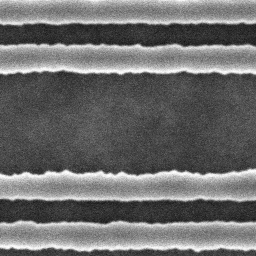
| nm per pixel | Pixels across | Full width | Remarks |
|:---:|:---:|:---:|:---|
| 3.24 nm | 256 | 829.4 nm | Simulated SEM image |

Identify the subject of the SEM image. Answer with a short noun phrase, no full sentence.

lines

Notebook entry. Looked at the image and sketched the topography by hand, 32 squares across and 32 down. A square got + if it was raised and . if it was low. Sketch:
++++++++++++++++++++++++++++++++
++++++++++++++++++++++++++++++++
++++++++++++++++++++++++++++++++
................................
................................
................................
++++++++++++++++++++++++++++++++
++++++++++++++++++++++++++++++++
++++++++++++++++++++++++++++++++
................................
................................
................................
................................
................................
................................
................................
................................
................................
................................
................................
................................
........+............+........++
++++++++++++++++++++++++++++++++
++++++++++++++++++++++++++++++++
++++++++++++++++++++++++++++++++
................................
................................
................................
++++++++++++++++++++++++++++++++
++++++++++++++++++++++++++++++++
++++++++++++++++++++++++++++++++
................................